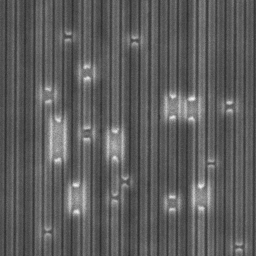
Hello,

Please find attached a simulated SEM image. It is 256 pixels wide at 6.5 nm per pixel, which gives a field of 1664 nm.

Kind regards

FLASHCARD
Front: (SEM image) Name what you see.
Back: parallel lines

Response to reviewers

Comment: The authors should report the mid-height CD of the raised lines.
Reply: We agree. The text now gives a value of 0.0439 micrometres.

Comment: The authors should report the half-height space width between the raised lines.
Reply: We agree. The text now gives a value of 18.7 nm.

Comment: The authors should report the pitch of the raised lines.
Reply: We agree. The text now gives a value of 62.2 nanometers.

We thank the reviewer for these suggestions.